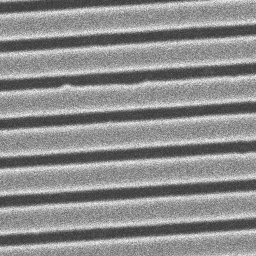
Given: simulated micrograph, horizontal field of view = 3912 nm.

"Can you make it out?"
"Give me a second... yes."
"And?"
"parallel lines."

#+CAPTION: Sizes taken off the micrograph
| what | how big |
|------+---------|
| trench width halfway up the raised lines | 0.173 um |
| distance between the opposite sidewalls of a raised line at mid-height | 425 nanometers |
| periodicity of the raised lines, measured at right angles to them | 38.7 pixels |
